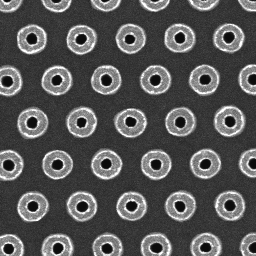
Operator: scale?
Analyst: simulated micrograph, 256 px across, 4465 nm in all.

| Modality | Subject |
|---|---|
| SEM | a regular array of ring-shaped raised bodies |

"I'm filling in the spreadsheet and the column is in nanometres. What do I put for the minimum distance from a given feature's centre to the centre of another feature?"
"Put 837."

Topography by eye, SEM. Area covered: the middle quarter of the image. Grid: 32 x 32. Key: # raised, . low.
..........##..........##........
#.......#####.......######......
#......#######......######......
##.....##...##.....###..###.....
##.....##...##.....###..###.....
##.....#######.....#######......
#.......#####.......######......
..........#.....................
................................
................................
................................
...####........###.........####.
..#####.......######......######
.###.###.....###.###......###.##
.##...##.....##...###.....##..##
.###.###.....###..##......##..##
.#######.....#######......######
..#####.......#####........####.
................................
................................
................................
................................
#.......#####........#####......
##......######......######......
##.....##...###....###..###.....
##.....##...###....###..###.....
##.....#######.....#######......
#.......######......######......
.........###..........##........
................................
................................
................................